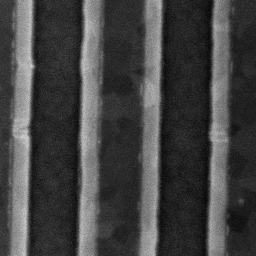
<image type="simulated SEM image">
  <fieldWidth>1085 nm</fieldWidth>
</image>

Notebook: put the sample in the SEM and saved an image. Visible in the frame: one or a few lines or trenches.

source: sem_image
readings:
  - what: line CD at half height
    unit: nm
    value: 274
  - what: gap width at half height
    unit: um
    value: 0.274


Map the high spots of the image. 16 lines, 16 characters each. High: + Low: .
++....++++....++
++....++++....++
++....++++....++
++....++++....++
++....++++....++
++....++++....++
+.....++++....++
+.....++++....++
+....++++.....++
+....++++.....++
+.....+++.....++
+....++++.....++
+....++++.....++
+....++++....+++
+....++++....+++
+....++++....+++